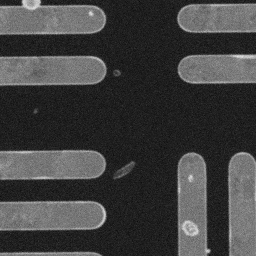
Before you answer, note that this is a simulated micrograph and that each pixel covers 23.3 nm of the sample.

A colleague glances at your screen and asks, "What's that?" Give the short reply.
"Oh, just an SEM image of groups of lines, slits or small figures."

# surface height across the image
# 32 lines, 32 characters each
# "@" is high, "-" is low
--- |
---@@---------------------------
@@@@@@@@@@@@@---------@@@@@@@@@@
@@@@@@@@@@@@@---------@@@@@@@@@@
@@@@@@@@@@@@@----------@@@@@@@@@
--------------------------------
--------------------------------
--------------------------------
@@@@@@@@@@@@@----------@@@@@@@@@
@@@@@@@@@@@@@---------@@@@@@@@@@
@@@@@@@@@@@@@----------@@@@@@@@@
@@@@@@@@@-----------------------
--------------------------------
--------------------------------
--------------------------------
--------------------------------
--------------------------------
--------------------------------
--------------------------------
--------------------------------
@@@@@@@@@@@@@----------@@----@@-
@@@@@@@@@@@@@---------@@@@---@@@
@@@@@@@@@@@@@--@------@@@@---@@@
----------------------@@@@---@@@
----------------------@@@@---@@@
----------------------@@@@---@@@
@@@@@@@@@@@@----------@@@@---@@@
@@@@@@@@@@@@@---------@@@@---@@@
@@@@@@@@@@@@@---------@@@@---@@@
@@@@@@@@@@@@----------@@@@---@@@
----------------------@@@@---@@@
----------------------@@@@---@@@
----------------------@@@@---@@@